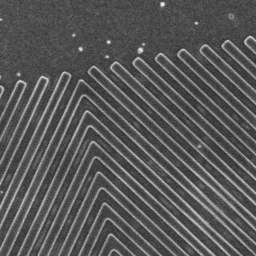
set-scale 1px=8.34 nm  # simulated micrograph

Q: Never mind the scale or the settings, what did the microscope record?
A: groups of lines, slits or small figures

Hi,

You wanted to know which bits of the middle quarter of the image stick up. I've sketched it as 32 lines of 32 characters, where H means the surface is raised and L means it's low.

LLLLLLLLLLLLHHLLLLHHHLLLHHHHLLLH
LLLLLLHHHLLLHHHLLLHHHHLLLHHHHLLL
HLLLLLHHHHLLLHHHHLLLHHHLLLHHHHLL
HLLLLLLHHHHLLLHHHLLLLHHHLLLHHHHL
HLLLHLLLHHHHLLLHHHHLLLHHHLLLLHHH
HLLHHHLLLHHHHLLLHHHHLLLHHHHLLHHH
LLLHHHHLLLLHHHLLLHHHHLLLHHHHLLLH
LLHHHHHHLLLHHHHLLLHHHHLLLHHHHLLL
LLHHLLHHHLLLLHHHLLLHHHHLLLHHHHLL
LHHHLLLHHHHLLLHHHLLLHHHHLLLHHHHL
LHHLLLLLHHHHLLLHHHLLLHHHHLLLHHHH
HHHLLLLLLHHHHLLLHHHHLLHHHHLLLHHH
HHLLLHHLLLHHHHLLLHHHLLLHHHHLLLHH
HHLLHHHHLLLHHHHLLLHHHHLLLHHHLLLH
HLLLHHHHHLLLHHHHLLLHHHHLLLHHHLLL
HLLLHHHHHHLLLHHHHLLLHHHHLLLHHHLL
HLLHHHLLHHHLLLHHHHLLLHHHHLLLHHHL
LLLHHLLLLHHHLLLHHHHLLLHHHHLLLHHH
LLHHHLLLLLHHHLLLLHHHLLLHHHHLLLHH
LLHHLLLHLLLHHHLLLLHHHLLLHHHHLLLH
LHHHLLHHHLLLHHHLLLLHHHLLLHHHHLLL
LHHHLLHHHHLLLHHHHLLLHHHLLLHHHHLL
HHHLLHHHHHHLLLHHHHLLLHHHLLLHHHHL
HHLLLHHHHHHHLLLHHHHLLLHHHLLLLHHH
HHLLHHHLLLHHHLLLHHHHLLLHHHHLLLHH
HHLLHHHLLLLHHHLLLHHHHLLLHHHHLLLH
HLLLHHLLLLLHHHHLLLHHHHLLLHHHHLLL
HLLHHHLLHHLLLHHHLLLHHHHLLLHHHHLL
LLHHHLLLHHHLLLHHHLLLHHHHLLLHHHHL
LLHHHLLHHHHHLLLHHHLLLLHHHLLLHHHH
LLHHLLLHHHHHHLLLHHHLLLHHHHLLLHHH
LHHHLLHHHLHHHHLLLHHHLLLLHHHLLLHH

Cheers